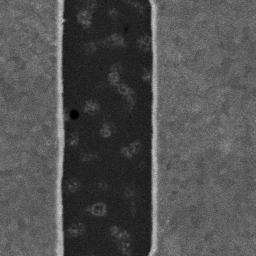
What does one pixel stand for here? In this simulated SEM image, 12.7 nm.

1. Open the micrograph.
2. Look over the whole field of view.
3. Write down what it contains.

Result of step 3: one or a few lines or trenches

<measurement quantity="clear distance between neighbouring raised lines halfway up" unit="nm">1200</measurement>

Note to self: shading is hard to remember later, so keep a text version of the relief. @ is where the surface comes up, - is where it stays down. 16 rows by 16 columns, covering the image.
@@@@------@@@@@@
@@@@------@@@@@@
@@@@------@@@@@@
@@@@------@@@@@@
@@@@------@@@@@@
@@@@------@@@@@@
@@@@------@@@@@@
@@@@------@@@@@@
@@@@------@@@@@@
@@@@------@@@@@@
@@@@------@@@@@@
@@@@------@@@@@@
@@@@------@@@@@@
@@@@------@@@@@@
@@@@------@@@@@@
@@@@------@@@@@@